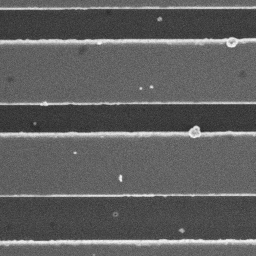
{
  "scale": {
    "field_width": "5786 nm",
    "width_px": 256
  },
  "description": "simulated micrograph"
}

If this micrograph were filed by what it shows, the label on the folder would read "lines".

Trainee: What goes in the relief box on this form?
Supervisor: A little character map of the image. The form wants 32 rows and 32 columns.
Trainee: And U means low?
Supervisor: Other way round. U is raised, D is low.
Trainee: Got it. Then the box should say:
UUUUUUUUUUUUUUUUUUUUUUUUUUUUUUUU
DDDDDDDDDDDDDDDDDDDDDDDDDDDDDDDD
DDDDDDDDDDDDDDDDDDDDDDDDDDDDDDDD
DDDDDDDDDDDDDDDDDDDDDDDDDDDDDDDD
DDDDDDDDDDDDDDDDDDDDDDDDDDDDDDDD
UUUUUUUUUUUUUUUUUUUUUUUUUUUUUUUU
UUUUUUUUUUUUUUUUUUUUUUUUUUUUUUUU
UUUUUUUUUUUUUUUUUUUUUUUUUUUUUUUU
UUUUUUUUUUUUUUUUUUUUUUUUUUUUUUUU
UUUUUUUUUUUUUUUUUUUUUUUUUUUUUUUU
UUUUUUUUUUUUUUUUUUUUUUUUUUUUUUUU
UUUUUUUUUUUUUUUUUUUUUUUUUUUUUUUU
UUUUUUUUUUUUUUUUUUUUUUUUUUUUUUUU
DDDDDDDDDDDDDDDDDDDDDDDDDDDDDDDD
DDDDDDDDDDDDDDDDDDDDDDDDDDDDDDDD
DDDDDDDDDDDDDDDDDDDDDDDDDDDDDDDD
DDDDDDDDDDDDDDDDDDDDDDDUUDDDDDDD
UUUUUUUUUUUUUUUUUUUUUUUUUUUUUUUU
UUUUUUUUUUUUUUUUUUUUUUUUUUUUUUUU
UUUUUUUUUUUUUUUUUUUUUUUUUUUUUUUU
UUUUUUUUUUUUUUUUUUUUUUUUUUUUUUUU
UUUUUUUUUUUUUUUUUUUUUUUUUUUUUUUU
UUUUUUUUUUUUUUUUUUUUUUUUUUUUUUUU
UUUUUUUUUUUUUUUUUUUUUUUUUUUUUUUU
UUUUUUUUUUUUUUUUUUUUUDDDDDDDDDDD
DDDDDDDDDDDDDDDDDDDDDDDDDDDDDDDD
DDDDDDDDDDDDDDDDDDDDDDDDDDDDDDDD
DDDDDDDDDDDDDDDDDDDDDDDDDDDDDDDD
DDDDDDDDDDDDDDDDDDDDDDDDDDDDDDDD
DDDDDDDDDDDDDDDDDDDDDDDDDDDDDDDD
UUUUUUUUUUUUUUUUUUUUUUUUUUUUUUUU
UUUUUUUUUUUUUUUUUUUUUUUUUUUUUUUU